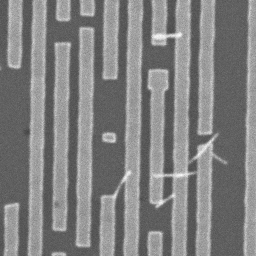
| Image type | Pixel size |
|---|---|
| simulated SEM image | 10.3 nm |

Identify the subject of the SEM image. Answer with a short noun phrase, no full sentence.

wiring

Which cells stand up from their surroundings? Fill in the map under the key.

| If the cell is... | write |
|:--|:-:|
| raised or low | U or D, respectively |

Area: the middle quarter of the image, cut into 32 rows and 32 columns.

UDDDUUUDDDUUUDDDUUUDDDDDDDDDUUUD
UDDDUUUDDDUUUDDDUUUDDDDDDDDDUUUD
UDDDUUUDDDUUUDDDUUUDDUUUUUDDUUUD
UDDDUUUDDDUUUDDDUUUDDUUUUUDDUUUD
UDDDUUUDDDDDDDDDUUUDDUUUUUDDUUUD
UDDDUUUDDDDDDDDDUUUDDUUUUUDDUUUD
UDDDUUUDDDDDDDDDUUUDDDUUUDDDUUUD
UDDDUUUDDDDDDDDDUUUDDDUUUDDDUUUD
UDDDUUUDDDDDDDDDUUUDDDUUUDDDUUUD
UDDDUUUDDDDDDDDDUUUDDDUUUDDDUUUD
UDDDUUUDDDDDDDDDUUUDDDUUUDDDUUUD
UDDDUUUDDDDDDDDDUUUDDDUUUDDDUUUD
UDDDUUUDDDDDDDDDUUUDDDUUUDDDUUUD
UDDDUUUDDDDDDDDDUUUDDDUUUDDDUUUD
UDDDUUUDDDDDDDDDUUUDDDUUUDDDUUUD
UDDDUUUDDDDDDDDDUUUDDDUUUDDDUUUD
UDDDUUUDDDDDDDDDUUUDDDUUUDDDUUUD
UDDDUUUDDDUUDDDDUUUDDDUUUDDDUUUD
UDDDUUUDDDUUUDDDUUUDDDUUUDDDUUUD
UDDDUUUDDDDDDDDDUUUDDDUUUDDDUUUD
UDDDUUUDDDDDDDDDUUUDDDUUUDDDUUUD
UDDDUUUDDDDDDDDDUUUDDDUUUDDDUUUD
UDDDUUUDDDDDDDDDUUUDDDUUUDDDUUUD
UDDDUUUDDDDDDDDDUUUDDDUUUDDDUUUD
UDDUUUUDDDDDDDDDUUUDDDUUUDDDUUUD
UDDUUUUDDDDDDDDDUUUDDDUUUDDDUUUD
UDDDUUUDDDDDDDDDUUUDDDUUUDDDUUUD
UDDUUUUDDDDDDDDDUUUDDDUUUDDUUUUD
UDDUUUUDDDDDDDDUUUUDDDUUUDDUUUUD
UDDUUUUDDDDDDDDUUUUDDDUUUDDUUUUD
UDDUUUUDDDDDDDDDUUUDDDUUDDDUUUUD
UDDUUUUDDDDDDDDDUUUDDDUUDDDUUUUD